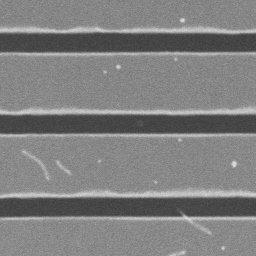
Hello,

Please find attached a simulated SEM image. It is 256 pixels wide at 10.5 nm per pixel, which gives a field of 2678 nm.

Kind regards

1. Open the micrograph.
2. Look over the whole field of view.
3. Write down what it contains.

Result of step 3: lines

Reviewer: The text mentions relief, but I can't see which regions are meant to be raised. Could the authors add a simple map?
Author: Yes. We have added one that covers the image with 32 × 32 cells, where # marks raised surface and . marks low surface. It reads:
################################
################################
################################
################################
................................
................................
................................
################################
################################
################################
################################
################################
################################
################################
................................
................................
................................
################################
################################
################################
################################
################################
################################
################################
################################
................................
................................
################################
################################
################################
################################
################################